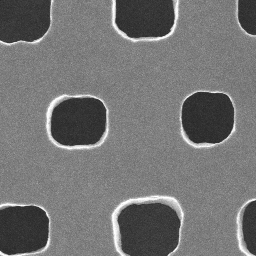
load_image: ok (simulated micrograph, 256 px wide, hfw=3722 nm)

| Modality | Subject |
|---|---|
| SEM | holes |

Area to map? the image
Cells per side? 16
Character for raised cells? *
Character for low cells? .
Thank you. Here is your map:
...****....****.
...****....****.
..**************
****************
****************
****************
****..*****...**
***....****....*
***...******..**
****************
****************
****************
****************
...****....****.
...****....****.
...*****...****.